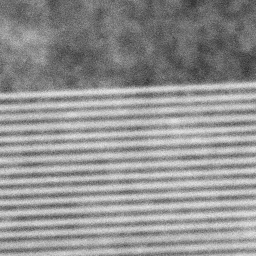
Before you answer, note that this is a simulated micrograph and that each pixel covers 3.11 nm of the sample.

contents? parallel lines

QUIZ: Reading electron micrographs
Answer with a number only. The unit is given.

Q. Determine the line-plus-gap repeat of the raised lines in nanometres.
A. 33.2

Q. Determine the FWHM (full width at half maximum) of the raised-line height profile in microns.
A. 0.0159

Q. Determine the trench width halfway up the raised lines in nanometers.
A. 15.9